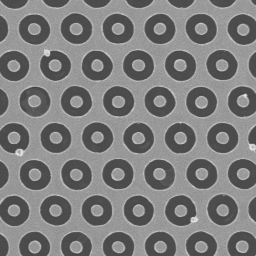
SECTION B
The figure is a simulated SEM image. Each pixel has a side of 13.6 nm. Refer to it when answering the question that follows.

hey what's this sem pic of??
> a regular array of ring-shaped grooves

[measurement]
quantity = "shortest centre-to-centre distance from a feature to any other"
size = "563 nanometres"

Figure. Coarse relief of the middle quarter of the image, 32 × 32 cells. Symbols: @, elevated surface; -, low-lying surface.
--@@---@@@--@@@--@@@---@@---@@@-
--@@@--@@---@@@---@@--@@@---@@--
-@@@@-------@@@-------@@@@------
@@@@@@-----@@@@@@----@@@@@@----@
@@@@@@@@@@@@@@@@@@@@@@@@@@@@@@@@
@@--@@@@@@@@@-@@@@@@@@@@@@@@@@@@
------@@@@@-----@@@@@-----@@@@@@
------@@@@-------@@@-------@@@@-
--@@---@@@--@@@--@@@---@@---@@@-
--@@@--@@@--@@@---@@---@@---@@@-
--@@---@@@---@@--@@@---@@---@@@-
------@@@@@------@@@@------@@@@-
@----@@@@@@@----@@@@@@----@@@@@@
@@@@@@@@@@@@@@@@@@@@@@@@@@@@@@@@
@@@@@@@@@@@@@@@@@@@@@@@@@@@@@@@@
@@@@@@-----@@@@@@----@@@@@@----@
-@@@@-------@@@-------@@@@------
--@@@--@@@--@@@--@@@--@@@---@@--
--@@---@@@---@@--@@@---@@---@@@-
--@@@--@@---@@@--@@@--@@@---@@@-
-@@@@-------@@@-------@@@@------
@@@@@@-----@@@@@-----@@@@@@-----
@@@@@@@@@@@@@@@@@@@@@@@@@@@@@@@@
@@@@@@@@@@@@@@@@@@@@@@@@@@@@@@@@
-----@@@@@@-----@@@@@@----@@@@@@
------@@@@-------@@@@------@@@@-
--@@---@@@--@@---@@@---@@--@@@@-
--@@@--@@@--@@@--@@@--@@@---@@@-
--@@@--@@@--@@@--@@@---@@---@@@-
-------@@@-------@@@@------@@@@-
@-----@@@@@-----@@@@@@-----@@@@@
@@@-@@@@@@@@@@@@@@@@@@@@@@@@@@@@